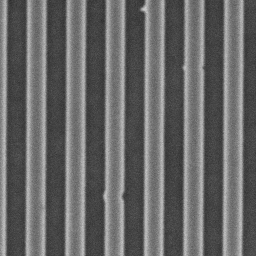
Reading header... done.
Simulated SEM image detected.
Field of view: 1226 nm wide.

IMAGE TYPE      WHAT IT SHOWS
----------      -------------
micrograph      parallel lines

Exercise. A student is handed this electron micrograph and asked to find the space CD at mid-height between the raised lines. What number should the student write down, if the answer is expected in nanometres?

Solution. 100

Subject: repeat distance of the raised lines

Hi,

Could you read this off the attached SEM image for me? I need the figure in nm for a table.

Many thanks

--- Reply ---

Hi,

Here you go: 189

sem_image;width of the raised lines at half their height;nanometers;86.7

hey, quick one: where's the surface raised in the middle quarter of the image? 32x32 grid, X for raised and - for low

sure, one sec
-XXXX------XXXX-----XXXXX-----XX
-XXXX------XXXX-----XXXXX-----XX
-XXXX------XXXX-----XXXXX-----XX
-XXXX------XXXX-----XXXXX-----XX
-XXXX------XXXX-----XXXXX-----XX
-XXXX------XXXX-----XXXXX-----XX
-XXXX------XXXX-----XXXXX-----XX
-XXXX------XXXX-----XXXXX-----XX
-XXXX------XXXX-----XXXXX-----XX
-XXXX------XXXX-----XXXXX-----XX
-XXXX------XXXX-----XXXXX-----XX
-XXXX------XXXX-----XXXXX-----XX
-XXXX------XXXX-----XXXXX-----XX
-XXXX------XXXX-----XXXXX-----XX
-XXXX------XXXX-----XXXXX-----XX
-XXXX------XXXX-----XXXXX-----XX
-XXXX------XXXX-----XXXXX-----XX
-XXXX------XXXX-----XXXXX-----XX
-XXXX------XXXX-----XXXXX-----XX
-XXXX------XXXX-----XXXXX-----XX
-XXXX------XXXX-----XXXXX-----XX
-XXXX------XXXX-----XXXXX-----XX
-XXXX------XXXX-----XXXXX-----XX
-XXXX-----XXXXX-----XXXXX-----XX
-XXXX-----XXXXX-----XXXXX-----XX
-XXXX-----XXXXX-----XXXXX-----XX
-XXXX-----XXXXX-----XXXXX-----XX
-XXXX-----XXXXX-----XXXXX-----XX
-XXXX-----XXXXX-----XXXXX-----XX
-XXXX-----XXXXX-----XXXXX-----XX
-XXXX-----XXXXX-----XXXXX-----XX
-XXXX-----XXXXX-----XXXXX-----XX